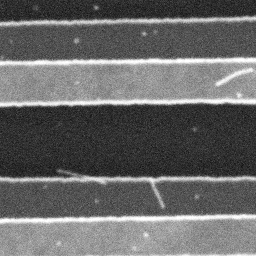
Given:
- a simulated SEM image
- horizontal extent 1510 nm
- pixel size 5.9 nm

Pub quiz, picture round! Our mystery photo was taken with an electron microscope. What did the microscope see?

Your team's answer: lines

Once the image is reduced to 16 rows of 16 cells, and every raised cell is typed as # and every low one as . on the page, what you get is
................
################
################
################
################
################
######..........
................
................
................
................
################
################
################
################
################